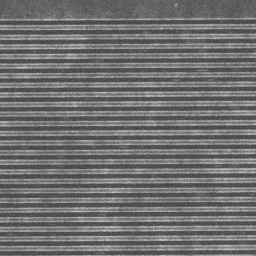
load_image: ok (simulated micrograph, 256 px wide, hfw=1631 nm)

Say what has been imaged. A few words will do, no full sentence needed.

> parallel lines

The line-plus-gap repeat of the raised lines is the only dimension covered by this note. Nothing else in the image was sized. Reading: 61.2 nanometers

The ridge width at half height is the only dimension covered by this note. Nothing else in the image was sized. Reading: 24.7 nm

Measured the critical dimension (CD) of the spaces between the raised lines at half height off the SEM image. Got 5.75 pixels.